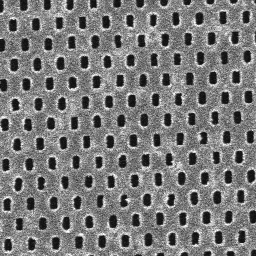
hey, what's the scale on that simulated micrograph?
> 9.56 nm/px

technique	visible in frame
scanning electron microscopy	a regular array of holes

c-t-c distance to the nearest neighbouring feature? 216 nm